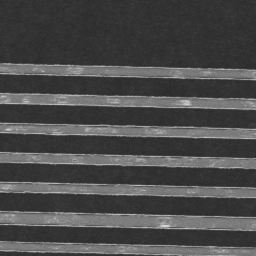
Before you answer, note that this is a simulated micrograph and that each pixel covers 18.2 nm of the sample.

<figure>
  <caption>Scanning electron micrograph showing parallel lines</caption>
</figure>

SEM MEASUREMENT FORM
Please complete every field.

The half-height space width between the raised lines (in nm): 159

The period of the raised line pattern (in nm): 543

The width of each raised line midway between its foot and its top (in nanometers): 377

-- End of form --